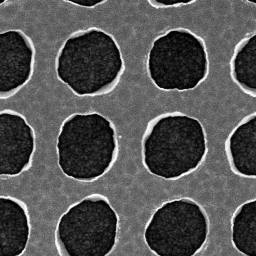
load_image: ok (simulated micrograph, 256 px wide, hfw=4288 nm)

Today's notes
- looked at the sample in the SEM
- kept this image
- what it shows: holes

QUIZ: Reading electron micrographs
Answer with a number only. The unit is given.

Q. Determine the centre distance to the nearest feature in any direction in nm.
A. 1420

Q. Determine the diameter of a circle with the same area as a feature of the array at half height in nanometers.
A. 1040